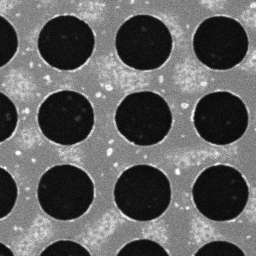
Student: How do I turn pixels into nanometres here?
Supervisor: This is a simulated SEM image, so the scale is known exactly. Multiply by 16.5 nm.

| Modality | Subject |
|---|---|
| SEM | a regular array of holes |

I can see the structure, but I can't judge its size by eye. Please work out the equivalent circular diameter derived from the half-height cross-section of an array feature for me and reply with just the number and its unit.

932 nm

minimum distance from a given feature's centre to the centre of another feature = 1230 nanometers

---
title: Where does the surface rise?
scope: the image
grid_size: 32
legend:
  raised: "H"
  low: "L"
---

HHHHHHHHHHHHHHHHHHHHHHHHHHHHHHHH
HHHHHHHHHHHHHHHHHHHHHHHHHHHHHHHH
LHHHHHLLLLHHHHHHLLLLHHHHHHLLLHHH
LLHHHLLLLLLHHHHLLLLLLHHHHLLLLLHH
LLHHHLLLLLLLHHHLLLLLLHHHLLLLLLLH
LLHHHLLLLLLLHHLLLLLLLLHHLLLLLLLH
LLHHHLLLLLLLHHHLLLLLLHHHLLLLLLLH
LHHHHLLLLLLHHHHLLLLLLHHHHLLLLLHH
HHHHHHHLLLHHHHHHLLLLHHHHHHLLLHHH
HHHHHHHHHHHHHHHHHHHHHHHHHHHHHHHH
HHHHHHHHHHHHHHHHHHHHHHHHHHHHHHHH
HHHHHHHLLHHHHHHHHLLHHHHHHHHLLHHH
LHHHHHLLLLLHHHHLLLLLLHHHHLLLLLHH
LLHHHLLLLLLLHHHLLLLLLHHHLLLLLLLH
LLHHHLLLLLLLHHLLLLLLLLHHLLLLLLLH
LLHHHLLLLLLLHHLLLLLLLLHHLLLLLLLH
LLHHHLLLLLLHHHHLLLLLLHHHHLLLLLLH
LHHHHHLLLLHHHHHHLLLLHHHHHHLLLLHH
HHHHHHHHHHHHHHHHHHHHHHHHHHHHHHHH
HHHHHHHHHHHHHHHHHHHHHHHHHHHHHHHH
HHHHHHHHHHHHHHHHHHHHHHHHHHHHHHHH
LHHHHHLLLLLHHHHLLLLLHHHHHLLLLLHH
LLHHHLLLLLLHHHHLLLLLLHHHHLLLLLLH
LLHHHLLLLLLLHHLLLLLLLHHHLLLLLLLH
LLHHHLLLLLLLHHLLLLLLLHHHLLLLLLLH
LLHHHLLLLLLHHHLLLLLLLHHHLLLLLLLH
LHHHHHLLLLLHHHHLLLLLLHHHHLLLLLHH
HHHHHHHHLHHHHHHHHLLHHHHHHHLLLHHH
HHHHHHHHHHHHHHHHHHHHHHHHHHHHHHHH
HHHHHHHHHHHHHHHHHHHHHHHHHHHHHHHH
HHHHHHLLLLHHHHHHLLLLHHHHHHLLLHHH
LLHHHLLLLLLHHHHLLLLLLHHHHLLLLLHH